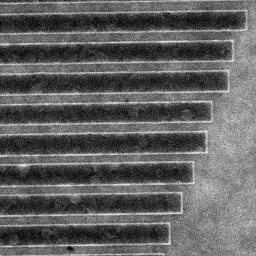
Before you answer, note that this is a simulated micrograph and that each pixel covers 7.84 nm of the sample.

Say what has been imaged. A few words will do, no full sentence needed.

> parallel lines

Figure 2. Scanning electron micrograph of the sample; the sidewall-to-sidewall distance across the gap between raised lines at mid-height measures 68.6 nanometres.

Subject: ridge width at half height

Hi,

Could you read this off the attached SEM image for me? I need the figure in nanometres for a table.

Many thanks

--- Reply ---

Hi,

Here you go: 167